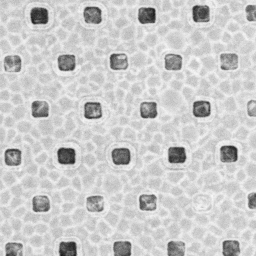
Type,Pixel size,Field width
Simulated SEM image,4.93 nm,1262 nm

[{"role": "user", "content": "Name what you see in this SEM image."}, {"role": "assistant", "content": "a regular array of holes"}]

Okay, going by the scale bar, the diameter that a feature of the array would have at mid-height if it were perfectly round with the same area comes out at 99.4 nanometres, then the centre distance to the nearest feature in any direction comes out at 53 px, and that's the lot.